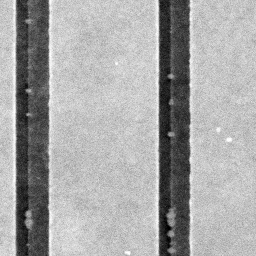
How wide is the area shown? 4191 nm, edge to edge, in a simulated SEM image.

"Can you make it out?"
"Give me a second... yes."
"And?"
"lines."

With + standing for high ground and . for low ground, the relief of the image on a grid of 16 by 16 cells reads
+..+++++++..++++
+..+++++++..++++
+..+++++++..++++
+..+++++++..++++
+..+++++++..++++
+..+++++++..++++
+..+++++++..++++
+..+++++++..++++
+..+++++++..++++
+..+++++++..++++
+..+++++++..++++
+..+++++++..++++
+..+++++++..++++
+..+++++++..++++
+..+++++++..++++
+..+++++++..++++